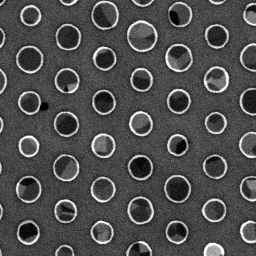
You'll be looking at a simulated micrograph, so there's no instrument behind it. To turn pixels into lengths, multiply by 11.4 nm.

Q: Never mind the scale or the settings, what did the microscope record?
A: a regular array of raised bodies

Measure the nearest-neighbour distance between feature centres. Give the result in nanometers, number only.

484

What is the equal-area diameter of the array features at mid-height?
22.8 pixels